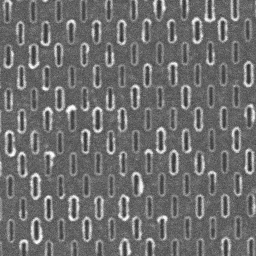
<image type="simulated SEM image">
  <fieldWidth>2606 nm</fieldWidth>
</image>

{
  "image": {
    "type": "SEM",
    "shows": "a regular array of holes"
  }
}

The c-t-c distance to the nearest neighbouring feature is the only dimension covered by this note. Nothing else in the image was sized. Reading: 252 nanometres